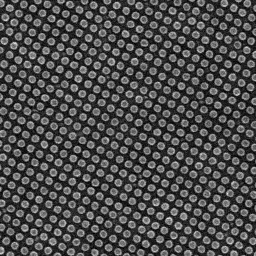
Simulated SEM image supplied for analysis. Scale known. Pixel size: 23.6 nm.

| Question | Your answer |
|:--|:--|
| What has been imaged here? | a regular array of raised bodies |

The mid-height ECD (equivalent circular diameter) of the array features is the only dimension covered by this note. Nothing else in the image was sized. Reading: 168 nm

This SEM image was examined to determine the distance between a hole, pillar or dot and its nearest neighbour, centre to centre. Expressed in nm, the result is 235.